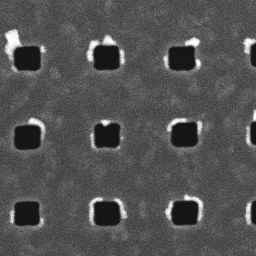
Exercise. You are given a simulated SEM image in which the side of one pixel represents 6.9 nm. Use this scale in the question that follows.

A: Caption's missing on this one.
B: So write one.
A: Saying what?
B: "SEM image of a regular array of holes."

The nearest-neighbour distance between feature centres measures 526 nm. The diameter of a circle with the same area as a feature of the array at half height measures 194 nanometers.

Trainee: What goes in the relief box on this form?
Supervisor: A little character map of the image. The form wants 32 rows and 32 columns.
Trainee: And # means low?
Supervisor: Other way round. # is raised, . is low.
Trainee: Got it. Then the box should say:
################################
################################
################################
################################
################################
################################
##...#######...######...#######.
##...#######...######...#######.
##...#######...######...########
################################
################################
################################
################################
################################
################################
##############.#######...######.
##...#######...######....######.
##...#######...######....######.
##...###########################
################################
################################
################################
################################
################################
################################
##...#######...#######...######.
##...#######...######....######.
##...#######...######....######.
################################
################################
################################
################################